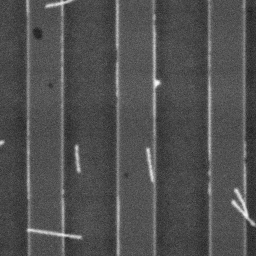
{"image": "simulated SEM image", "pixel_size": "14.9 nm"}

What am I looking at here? lines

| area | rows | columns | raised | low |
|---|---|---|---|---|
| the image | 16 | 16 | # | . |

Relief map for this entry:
..##...###...##.
..##...###...##.
..##...###...##.
..##...###...##.
..##...###...##.
..##...###...##.
..##...###...##.
..##...###...##.
..##...###...##.
..##...###...##.
..##...###...##.
..##...###...##.
..##...###...##.
..##...###...##.
..##...###...##.
..##...###...##.